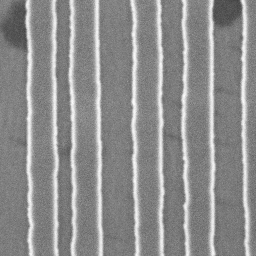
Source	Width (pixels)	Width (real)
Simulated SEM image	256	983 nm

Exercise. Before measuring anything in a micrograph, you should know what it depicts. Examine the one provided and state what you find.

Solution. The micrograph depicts lines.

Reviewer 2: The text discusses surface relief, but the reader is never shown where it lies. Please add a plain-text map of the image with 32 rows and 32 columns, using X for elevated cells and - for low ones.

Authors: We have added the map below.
---XXXX--XXX----XXXX---XXXX---XX
---XXXX--XXX-----XXX---XXX----XX
---XXXX--XXX-----XXX---XXXX---XX
---XXXX--XXX-----XXX---XXXX---XX
---XXXX--XXX-----XXX---XXXX---XX
----XXX--XXX-----XXX---XXXX---XX
----XXX--XXX-----XXX---XXXX---XX
----XXX--XXX-----XXX---XXXX---XX
----XXX--XXX-----XXX---XXXX---XX
----XXX--XXX-----XXX---XXXX---XX
---XXXX--XXX-----XXX---XXXX---XX
---XXXX--XXX-----XXX---XXXX---XX
---XXXX--XXX-----XXX---XXXX---XX
----XXX--XXX-----XXX---XXXX---XX
---XXXX--XXX-----XXX---XXXX---XX
----XXX--XXX-----XXX---XXXX---XX
----XXX--XXX-----XXX---XXXX---XX
----XXX--XXXX----XXX---XXXX---XX
----XXX--XXXX----XXX---XXXX---XX
---XXXX--XXXX----XXX---XXXX---XX
---XXXX--XXXX----XXX---XXXX---XX
---XXXX--XXXX----XXX---XXXX----X
----XXX--XXXX----XXX---XXXX---XX
----XXX--XXXX----XXX---XXXX----X
----XXX--XXXX----XXX---XXXX----X
----XXX--XXXX----XXX---XXXX----X
----XXX--XXXX----XXX---XXXX----X
----XXX--XXXX----XXX---XXXX----X
----XXX--XXXX----XXX---XXXX----X
----XXX--XXXX----XXX---XXXX----X
----XXX--XXXX----XXX---XXXX----X
----XXX--XXXX----XXX---XXXX----X